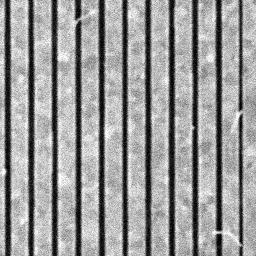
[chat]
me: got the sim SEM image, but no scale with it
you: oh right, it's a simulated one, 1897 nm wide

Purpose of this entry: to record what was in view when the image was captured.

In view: parallel lines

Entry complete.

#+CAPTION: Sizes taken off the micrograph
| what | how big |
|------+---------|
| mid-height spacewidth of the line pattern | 51.9 nm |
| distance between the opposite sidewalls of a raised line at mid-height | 119 nanometers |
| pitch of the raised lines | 174 nm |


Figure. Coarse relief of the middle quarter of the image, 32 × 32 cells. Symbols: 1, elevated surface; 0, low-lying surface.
11000111000111001111001111001111
11000111000111001111001111001111
11100111000111001111001111001111
11100111000111001111001111001111
11100111000111001111001111001111
11100111000111001111001111001111
11100111000111001111001111001111
11100111000111001111001111001111
11100111000111001111001111001111
11100111000111001111001111001111
11100111000111001111001111001111
11100111000111001111001111001111
11100111000111001111001111001111
11100111000111001111001111001111
11100111001111001111001111001111
11100111001111001111001111001111
11100111001111001111001111001111
11100111001111001111001111001111
11100111001111001111001111001111
11100111001111001111001111001111
11100111001111001111001111001111
11100111001111001111001111001111
11100111001111001111001111001111
11100111001111001111001111001111
11100111001111001111001111001111
11100111001111001111001111001111
11100111001111001111001111001111
11100111001111001111001111001111
11100111001111001111001111001111
11100111001111001111001111001111
11100111001111001111001111001111
11100111001111001111001111001111